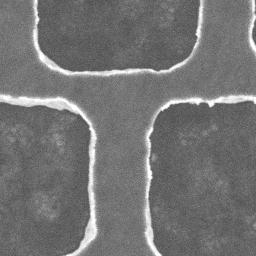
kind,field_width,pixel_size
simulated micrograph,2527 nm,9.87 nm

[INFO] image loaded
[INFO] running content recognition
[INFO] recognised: holes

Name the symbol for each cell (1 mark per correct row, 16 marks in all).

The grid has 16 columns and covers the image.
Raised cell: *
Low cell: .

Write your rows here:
**..........****
**..........****
**..........****
***.........****
****************
****************
....*******.....
.....*****......
......***.......
......***.......
......***.......
......***.......
......***.......
......***.......
......****......
.....*****......